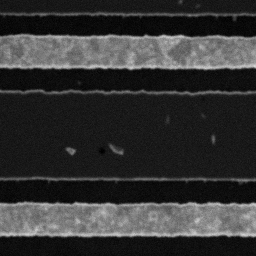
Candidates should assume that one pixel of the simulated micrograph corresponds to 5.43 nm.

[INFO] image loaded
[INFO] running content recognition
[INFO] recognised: lines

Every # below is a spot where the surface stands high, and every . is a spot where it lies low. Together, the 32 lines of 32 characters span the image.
################################
################################
................................
................................
..##..................#.........
################################
################################
################################
...#...##..#....##..########.#..
................................
................................
######..##.##.#####..#...###....
################################
################################
################################
################################
################################
################################
################################
################################
################################
################################
..........................#..###
................................
................................
..####.#.#........#.##.#..##.#..
################################
################################
################################
....................##........#.
................................
................................